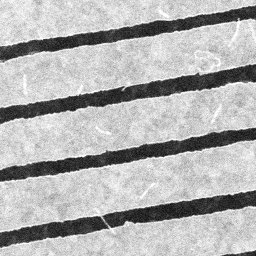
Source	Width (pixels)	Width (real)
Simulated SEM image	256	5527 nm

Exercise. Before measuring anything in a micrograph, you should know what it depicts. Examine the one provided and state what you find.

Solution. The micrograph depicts one or a few lines or trenches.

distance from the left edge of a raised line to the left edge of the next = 1.32 microns